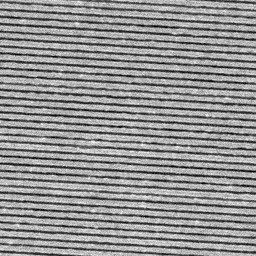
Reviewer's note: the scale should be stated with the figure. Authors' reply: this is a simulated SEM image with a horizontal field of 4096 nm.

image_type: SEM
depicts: parallel lines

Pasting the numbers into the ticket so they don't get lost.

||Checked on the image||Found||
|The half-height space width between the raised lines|45.9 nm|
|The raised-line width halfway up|75.9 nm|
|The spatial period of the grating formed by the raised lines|117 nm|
